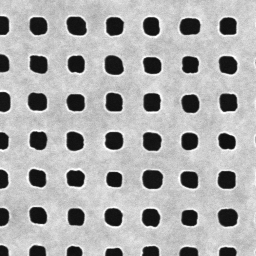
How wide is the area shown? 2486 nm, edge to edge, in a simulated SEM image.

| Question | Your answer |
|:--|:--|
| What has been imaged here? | a regular array of holes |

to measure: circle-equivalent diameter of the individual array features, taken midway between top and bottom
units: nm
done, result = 184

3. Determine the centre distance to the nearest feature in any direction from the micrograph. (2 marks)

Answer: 0.364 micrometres